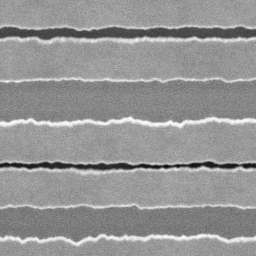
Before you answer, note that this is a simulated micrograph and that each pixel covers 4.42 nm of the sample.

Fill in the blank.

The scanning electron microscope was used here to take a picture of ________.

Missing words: lines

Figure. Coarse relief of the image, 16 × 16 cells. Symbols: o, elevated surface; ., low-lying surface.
oooooooooooooooo
oooooooooooooooo
oooooooooooooooo
oooooooooooooooo
oooooooooooooooo
................
................
.o.....oo....ooo
oooooooooooooooo
oooooooooooooooo
oooooooooooooooo
oooooooooooooooo
oooooooooooooooo
................
................
oooooooooooooooo